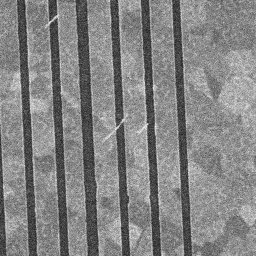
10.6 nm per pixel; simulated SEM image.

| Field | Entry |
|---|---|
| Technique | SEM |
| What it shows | parallel lines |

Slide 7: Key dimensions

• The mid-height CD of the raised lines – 0.229 um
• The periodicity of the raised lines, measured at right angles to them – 0.328 micrometres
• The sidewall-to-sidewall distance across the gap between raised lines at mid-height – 95.5 nanometers